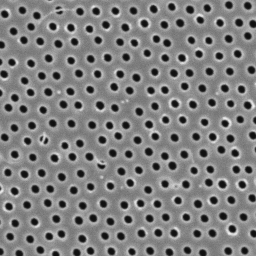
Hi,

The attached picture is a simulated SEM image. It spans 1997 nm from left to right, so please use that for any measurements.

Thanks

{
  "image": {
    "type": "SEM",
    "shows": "a regular array of holes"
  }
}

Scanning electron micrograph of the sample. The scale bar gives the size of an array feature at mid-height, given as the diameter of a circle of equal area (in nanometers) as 61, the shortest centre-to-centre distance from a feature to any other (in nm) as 124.